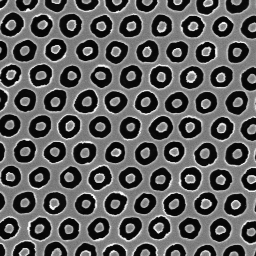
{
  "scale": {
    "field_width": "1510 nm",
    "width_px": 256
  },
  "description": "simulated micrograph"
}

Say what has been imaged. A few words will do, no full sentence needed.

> a regular array of ring-shaped grooves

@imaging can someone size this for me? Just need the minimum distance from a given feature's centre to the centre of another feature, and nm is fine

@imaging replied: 168